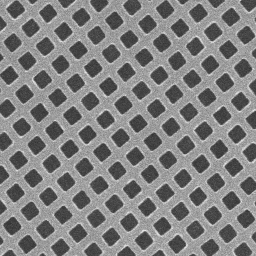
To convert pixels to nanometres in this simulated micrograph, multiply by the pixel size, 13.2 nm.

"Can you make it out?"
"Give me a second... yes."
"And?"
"a regular array of holes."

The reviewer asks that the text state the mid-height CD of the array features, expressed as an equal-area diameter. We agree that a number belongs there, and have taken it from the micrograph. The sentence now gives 224 nm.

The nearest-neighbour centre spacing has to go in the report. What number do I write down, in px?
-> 23.1